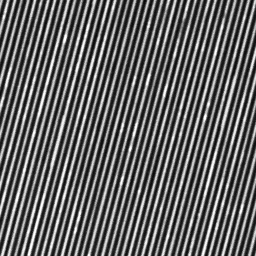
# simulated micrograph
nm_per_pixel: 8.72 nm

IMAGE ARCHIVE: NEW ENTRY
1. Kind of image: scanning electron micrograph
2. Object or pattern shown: parallel lines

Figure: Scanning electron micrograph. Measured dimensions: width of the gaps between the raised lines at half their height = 0.0391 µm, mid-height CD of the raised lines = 0.0159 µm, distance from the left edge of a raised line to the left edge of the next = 56.4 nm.